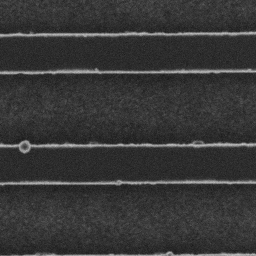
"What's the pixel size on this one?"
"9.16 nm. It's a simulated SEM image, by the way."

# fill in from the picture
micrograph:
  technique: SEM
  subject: lines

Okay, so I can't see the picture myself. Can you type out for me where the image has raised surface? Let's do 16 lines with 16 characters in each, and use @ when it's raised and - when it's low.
----------------
----------------
@@@@@@@@@@@@@@@@
@@@@@@@@@@@@@@@@
@@@@@@@@@@@-----
----------------
----------------
----------------
----------------
@@@@@@@@@@@@@@@@
@@@@@@@@@@@@@@@@
----------------
----------------
----------------
----------------
----------------